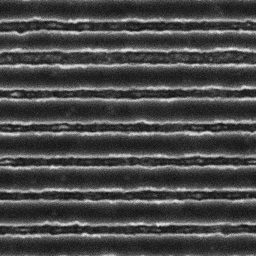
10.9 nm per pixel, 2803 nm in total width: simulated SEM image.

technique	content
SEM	parallel lines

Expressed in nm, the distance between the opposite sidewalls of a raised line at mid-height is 267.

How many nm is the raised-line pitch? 375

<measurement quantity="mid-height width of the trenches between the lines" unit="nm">107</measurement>